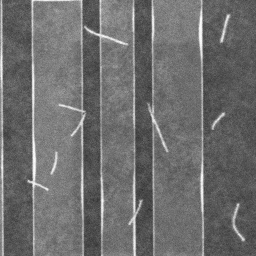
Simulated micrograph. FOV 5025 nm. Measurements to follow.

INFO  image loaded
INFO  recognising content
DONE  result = groups of lines, slits or small figures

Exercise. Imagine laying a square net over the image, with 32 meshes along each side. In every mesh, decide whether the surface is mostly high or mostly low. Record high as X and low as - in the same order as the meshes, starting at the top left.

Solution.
----XXXXXX---XXXX--XXXXXX-------
----XXXXXX---XXXX--XXXXXX-------
----XXXXXX---XXXX--XXXXXX-------
----XXXXXX---XXXX--XXXXXX-------
----XXXXXX--XXXXX--XXXXXX-------
----XXXXXX---XXXX--XXXXXX-------
----XXXXXX---XXXX--XXXXXX-------
----XXXXXX---XXXX--XXXXXX-------
----XXXXXX---XXXX--XXXXXX-------
----XXXXXX---XXXX--XXXXXX-------
----XXXXXX---XXXX--XXXXXX-------
----XXXXXX---XXXX--XXXXXX-------
----XXXXXX---XXXX--XXXXXX-------
----XXXXXX---XXXX--XXXXXX-------
----XXXXXX---XXXX--XXXXXX-------
----XXXXXX---XXXX--XXXXXX-------
----XXXXXX---XXXX--XXXXXX-------
----XXXXXX---XXXX--XXXXXX-------
----XXXXXX---XXXX--XXXXXX-------
----XXXXXX---XXXX--XXXXXX-------
----XXXXXX---XXXX--XXXXXX-------
----XXXXXX---XXXX--XXXXXX-------
----XXXXXX---XXXX--XXXXXX-------
----XXXXXX---XXXX--XXXXXX-------
----XXXXXX---XXXX--XXXXXX-------
----XXXXXX---XXXX--XXXXXX-------
----XXXXXX---XXXX--XXXXXX-------
----XXXXXX---XXXX--XXXXXX-------
----XXXXXX---XXXX--XXXXXX-------
----XXXXXX---XXXX--XXXXXX-------
----XXXXXX---XXXX--XXXXXX-------
----XXXXXX---XXXX--XXXXXX-------